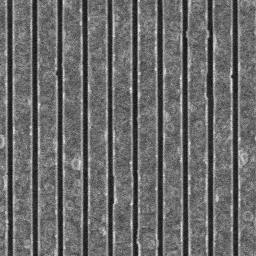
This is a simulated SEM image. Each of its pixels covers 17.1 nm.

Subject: parallel lines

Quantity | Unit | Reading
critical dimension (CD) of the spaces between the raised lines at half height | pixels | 5.37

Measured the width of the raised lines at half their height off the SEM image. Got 0.336 µm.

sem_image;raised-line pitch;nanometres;429